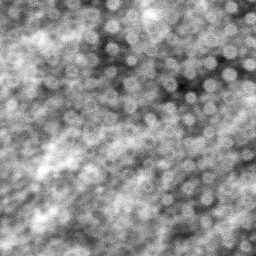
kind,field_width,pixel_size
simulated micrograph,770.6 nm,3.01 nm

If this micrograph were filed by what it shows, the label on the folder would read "a regular array of raised bodies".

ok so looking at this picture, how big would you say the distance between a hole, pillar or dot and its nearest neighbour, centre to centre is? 67.4 nm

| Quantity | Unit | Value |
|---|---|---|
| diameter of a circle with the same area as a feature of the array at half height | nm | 30.8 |